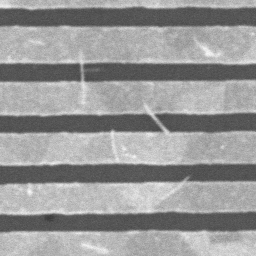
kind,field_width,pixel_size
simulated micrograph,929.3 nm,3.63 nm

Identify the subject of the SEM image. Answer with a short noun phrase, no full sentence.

lines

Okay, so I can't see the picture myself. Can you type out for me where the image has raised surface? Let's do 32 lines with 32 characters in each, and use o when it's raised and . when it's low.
oooooooooooooooooooooooooooooooo
................................
................................
oooooooooooooooooooooooooooooooo
oooooooooooooooooooooooooooooooo
oooooooooooooooooooooooooooooooo
oooooooooooooooooooooooooooooooo
oooooooooooooooooooooooooooooooo
................................
................................
oooooooooooooooooooooooooooooooo
oooooooooooooooooooooooooooooooo
oooooooooooooooooooooooooooooooo
oooooooooooooooooooooooooooooooo
................................
................................
..............o.....o...........
oooooooooooooooooooooooooooooooo
oooooooooooooooooooooooooooooooo
oooooooooooooooooooooooooooooooo
ooooo...........................
................................
................................
oooooooooooooooooooooooooooooooo
oooooooooooooooooooooooooooooooo
oooooooooooooooooooooooooooooooo
oooooooooooooooooooo...oooo.....
................................
................................
oooooooooooooooooooooooooooooooo
oooooooooooooooooooooooooooooooo
oooooooooooooooooooooooooooooooo